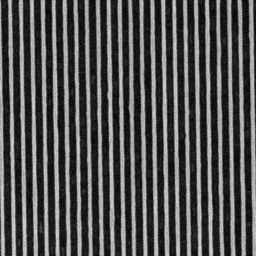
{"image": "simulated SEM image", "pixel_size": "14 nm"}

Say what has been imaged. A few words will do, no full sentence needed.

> parallel lines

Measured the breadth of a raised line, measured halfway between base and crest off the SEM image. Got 41.9 nm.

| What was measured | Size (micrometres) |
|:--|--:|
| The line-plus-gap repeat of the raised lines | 0.153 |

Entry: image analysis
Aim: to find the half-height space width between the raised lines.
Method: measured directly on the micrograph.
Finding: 7.87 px